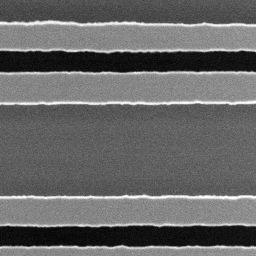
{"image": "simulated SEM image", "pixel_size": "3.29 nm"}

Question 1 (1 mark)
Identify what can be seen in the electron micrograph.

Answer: lines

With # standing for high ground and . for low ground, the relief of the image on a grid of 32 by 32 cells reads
................................
................................
................................
################################
################################
################################
.............#..................
................................
................................
################################
################################
################################
################################
................................
................................
................................
................................
................................
................................
................................
................................
................................
................................
................................
................................
################################
################################
################################
................................
................................
................................
################################